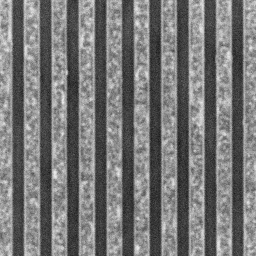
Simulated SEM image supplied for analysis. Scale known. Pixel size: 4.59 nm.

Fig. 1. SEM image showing parallel lines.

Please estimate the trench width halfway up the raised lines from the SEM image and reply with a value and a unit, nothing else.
13 pixels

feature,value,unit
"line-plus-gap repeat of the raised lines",27.4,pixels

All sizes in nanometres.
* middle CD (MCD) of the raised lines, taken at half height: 67.7